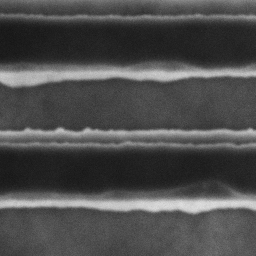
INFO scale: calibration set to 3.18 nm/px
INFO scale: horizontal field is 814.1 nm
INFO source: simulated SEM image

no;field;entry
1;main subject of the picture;lines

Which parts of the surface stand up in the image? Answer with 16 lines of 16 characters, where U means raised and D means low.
UUUUUUUUUUUUUUUU
UUUUUUUUUUUUUUUU
UUUUUUUUUUUUUUUU
UUUUUUUUUUUUUUUU
UUUUUUUUUUUUUUUU
DDDDDDDDDDDDDDDD
DDDDDDDDDDDDDDDD
DDDDDDDDDDDDDDDD
UUUUUUUUUUUUUUUU
UUUUUUUUUUUUUUUU
UUUUUUUUUUUUUUUU
UUUUUUUUUUUUUUUU
UUUUUUUUUUUUUUUU
DDDDDDDDDDDDDDDD
DDDDDDDDDDDDDDDD
DDDDDDDDDDDDDDDD